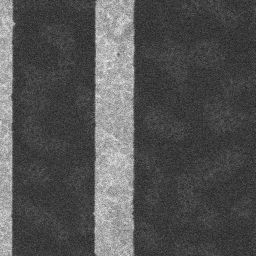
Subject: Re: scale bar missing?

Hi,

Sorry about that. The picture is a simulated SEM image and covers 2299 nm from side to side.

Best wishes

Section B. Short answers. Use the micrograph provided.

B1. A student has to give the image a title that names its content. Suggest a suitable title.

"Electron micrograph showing one or a few lines or trenches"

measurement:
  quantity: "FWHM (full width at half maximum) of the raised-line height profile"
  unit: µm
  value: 0.335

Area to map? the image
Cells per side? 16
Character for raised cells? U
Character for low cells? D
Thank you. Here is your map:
UDDDDDUUDDDDDDDD
UDDDDDUUDDDDDDDD
UDDDDDUUDDDDDDDD
UDDDDDUUDDDDDDDD
UDDDDDUUDDDDDDDD
UDDDDDUUDDDDDDDD
UDDDDDUUDDDDDDDD
UDDDDDUUDDDDDDDD
UDDDDDUUDDDDDDDD
UDDDDDUUDDDDDDDD
UDDDDDUUDDDDDDDD
DDDDDDUUDDDDDDDD
UDDDDDUUDDDDDDDD
UDDDDDUUDDDDDDDD
UDDDDDUUDDDDDDDD
UDDDDDUUDDDDDDDD